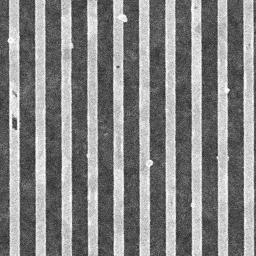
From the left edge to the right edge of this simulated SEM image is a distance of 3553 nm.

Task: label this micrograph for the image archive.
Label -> parallel lines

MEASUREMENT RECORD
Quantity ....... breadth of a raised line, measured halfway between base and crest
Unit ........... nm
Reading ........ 128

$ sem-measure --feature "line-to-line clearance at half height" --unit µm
0.231